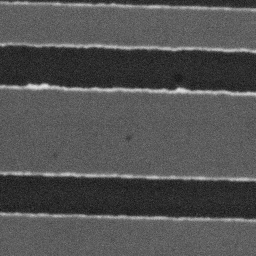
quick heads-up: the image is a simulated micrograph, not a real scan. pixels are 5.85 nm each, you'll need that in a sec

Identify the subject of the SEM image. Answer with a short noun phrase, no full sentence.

lines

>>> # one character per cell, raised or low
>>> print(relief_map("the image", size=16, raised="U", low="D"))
UUUUUUUUUUUUUDDD
UUUUUUUUUUUUUUUU
UUUUUUUUUUUUUUUU
DDDDDDDDDDDDDDDD
DDDDDDDDDDDDDDDD
UUUUDDDDDDDDDDDD
UUUUUUUUUUUUUUUU
UUUUUUUUUUUUUUUU
UUUUUUUUUUUUUUUU
UUUUUUUUUUUUUUUU
UUUUUUUUUUUUUUUU
DDDDDDDDDDDDDDDD
DDDDDDDDDDDDDDDD
UUUUUUDDDDDDDDDD
UUUUUUUUUUUUUUUU
UUUUUUUUUUUUUUUU